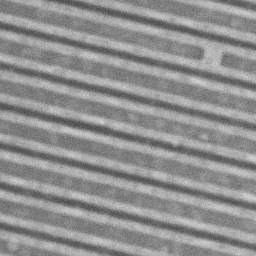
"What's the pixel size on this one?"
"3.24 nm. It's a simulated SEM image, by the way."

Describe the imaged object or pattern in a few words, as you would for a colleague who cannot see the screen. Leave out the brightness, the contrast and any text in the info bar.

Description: parallel lines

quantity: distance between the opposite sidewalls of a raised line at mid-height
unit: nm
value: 27.2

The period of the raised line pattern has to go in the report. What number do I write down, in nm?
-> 62.8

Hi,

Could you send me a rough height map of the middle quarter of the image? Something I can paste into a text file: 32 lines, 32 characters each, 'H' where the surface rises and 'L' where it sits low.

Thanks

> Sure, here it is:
LLLLLLLLLLLLLLHHHHHHHLLLLLLLLLLH
HLLLLLLLLLLLLLLLLHHHHHHHHLLLLLLL
HHHHHLLLLLLLLLLLLLLLLLHHHHHHHHLL
HHHHHHHHHHLLLLLLLLLLLLLLLLHHHHHH
LLLLLHHHHHHHHHLLLLLLLLLLLLLLLLHH
HLLLLLLLLHHHHHHHHHLLLLLLLLLLLLLL
HHHHLLLLLLLLLHHHHHHHHHLLLLLLLLLL
LHHHHHHHHLLLLLLLLLHHHHHHHHLLLLLL
LLLLLHHHHHHHHLLLLLLLLLHHHHHHHHLL
LLLLLLLLLHHHHHHHHLLLLLLLLLHHHHHH
LLLLLLLLLLLLLHHHHHHHHHLLLLLLLLHH
HLLLLLLLLLLLLLLLLHHHHHHHHHLLLLLL
HHHHHLLLLLLLLLLLLLLLLHHHHHHHHHLL
LHHHHHHHHLLLLLLLLLLLLLLLLLHHHHHH
LLLLLHHHHHHHHLLLLLLLLLLLLLLLLLHH
HLLLLLLLLLHHHHHHHHLLLLLLLLLLLLLL
HHHHHLLLLLLLLHHHHHHHHHLLLLLLLLLL
LHHHHHHHHLLLLLLLLHHHHHHHHHLLLLLL
LLLLHHHHHHHHHLLLLLLLLHHHHHHHHHLL
LLLLLLLLLHHHHHHHHLLLLLLLLHHHHHHH
LLLLLLLLLLLLLHHHHHHHHLLLLLLLLLHH
HLLLLLLLLLLLLLLLLHHHHHHHHLLLLLLL
HHHHHHLLLLLLLLLLLLLLLHHHHHHHHHLL
LHHHHHHHHHLLLLLLLLLLLLLLLHHHHHHH
LLLLLHHHHHHHHHLLLLLLLLLLLLLLLHHH
HLLLLLLLLHHHHHHHHHLLLLLLLLLLLLLL
HHHHHLLLLLLLLHHHHHHHHHLLLLLLLLLL
LHHHHHHHHLLLLLLLLLHHHHHHHHLLLLLL
LLLLLHHHHHHHHLLLLLLLLLHHHHHHHLLL
LLLLLLLLLHHHHHHHHHLLLLLLLLHHHHHH
LLLLLLLLLLLLLHHHHHHHHHLLLLLLLLHH
HLLLLLLLLLLLLLLLLHHHHHHHHHLLLLLL